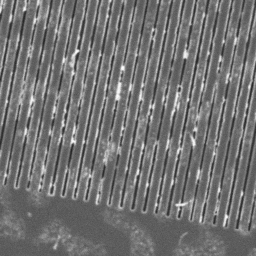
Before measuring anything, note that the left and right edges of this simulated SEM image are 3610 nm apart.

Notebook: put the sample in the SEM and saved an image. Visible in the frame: parallel lines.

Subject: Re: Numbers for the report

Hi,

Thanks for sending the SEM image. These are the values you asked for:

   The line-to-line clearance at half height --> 27.7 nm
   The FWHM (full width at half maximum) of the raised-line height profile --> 137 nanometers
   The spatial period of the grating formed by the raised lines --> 166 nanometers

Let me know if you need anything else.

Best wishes